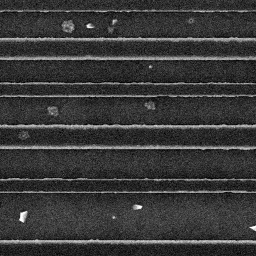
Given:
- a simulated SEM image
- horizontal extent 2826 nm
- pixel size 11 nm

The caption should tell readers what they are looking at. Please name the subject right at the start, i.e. lines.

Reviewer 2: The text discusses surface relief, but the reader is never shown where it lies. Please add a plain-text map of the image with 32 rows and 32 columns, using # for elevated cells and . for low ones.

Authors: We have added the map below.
################################
................................
................................
................................
................................
################################
################################
................................
................................
................................
################################
################################
................................
................................
................................
................................
################################
################################
...#..#####..###################
................................
................................
................................
################################
################################
................................
................................
................................
................................
................................
................................
################################
################################